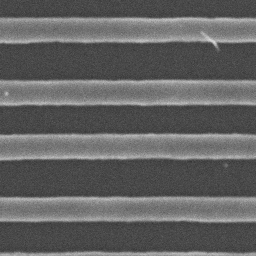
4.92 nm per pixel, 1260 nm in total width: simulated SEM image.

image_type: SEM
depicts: lines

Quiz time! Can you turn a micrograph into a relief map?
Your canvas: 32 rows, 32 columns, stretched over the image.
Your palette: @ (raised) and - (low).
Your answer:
--------------------------------
--------------------------------
@@@@@@@@@@@@@@@@@@@@@@@@@@@@@@@@
@@@@@@@@@@@@@@@@@@@@@@@@@@@@@@@@
@@@@@@@@@@@@@@@@@@@@@@@@@@@@@@@@
--------------------------------
--------------------------------
--------------------------------
--------------------------------
--------------------------------
@@@@@@@@@@@@@@@@@@@@@@@@@@@@@@@@
@@@@@@@@@@@@@@@@@@@@@@@@@@@@@@@@
@@@@@@@@@@@@@@@@@@@@@@@@@@@@@@@@
--------------------------------
--------------------------------
--------------------------------
--------------------------------
@@@@@@@@@@@@@@@@@@@@@@@@@@@@@@@@
@@@@@@@@@@@@@@@@@@@@@@@@@@@@@@@@
@@@@@@@@@@@@@@@@@@@@@@@@@@@@@@@@
--------------------------------
--------------------------------
--------------------------------
--------------------------------
--------------------------------
@@@@@@@@@@@@@@@@@@@@@@@@@@@@@@@@
@@@@@@@@@@@@@@@@@@@@@@@@@@@@@@@@
@@@@@@@@@@@@@@@@@@@@@@@@@@@@@@@@
--------------------------------
--------------------------------
--------------------------------
--------------------------------